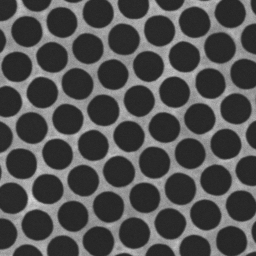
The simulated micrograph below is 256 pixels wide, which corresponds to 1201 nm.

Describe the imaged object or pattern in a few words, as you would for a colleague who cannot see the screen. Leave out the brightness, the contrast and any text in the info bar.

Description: a regular array of holes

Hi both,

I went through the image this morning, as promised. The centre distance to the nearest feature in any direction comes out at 0.17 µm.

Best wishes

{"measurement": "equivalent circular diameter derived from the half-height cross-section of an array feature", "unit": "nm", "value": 145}